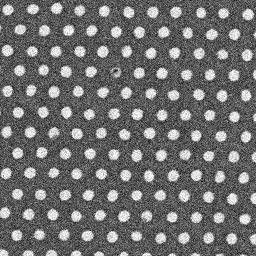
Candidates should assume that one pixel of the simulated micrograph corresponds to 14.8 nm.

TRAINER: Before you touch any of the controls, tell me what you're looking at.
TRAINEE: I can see a regular array of raised bodies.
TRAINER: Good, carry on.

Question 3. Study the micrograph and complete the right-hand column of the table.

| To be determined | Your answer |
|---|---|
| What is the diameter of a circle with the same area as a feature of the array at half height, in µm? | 0.162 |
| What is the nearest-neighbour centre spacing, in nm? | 339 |